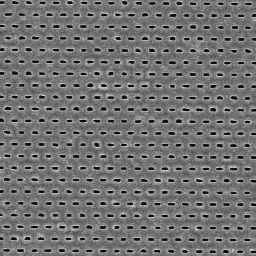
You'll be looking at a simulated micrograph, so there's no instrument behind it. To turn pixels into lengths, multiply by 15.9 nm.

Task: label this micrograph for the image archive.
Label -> a regular array of holes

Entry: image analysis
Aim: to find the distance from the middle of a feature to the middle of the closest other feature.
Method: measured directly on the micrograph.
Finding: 212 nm